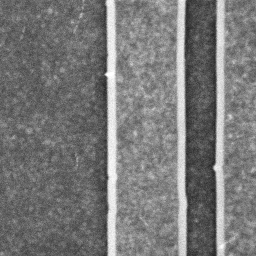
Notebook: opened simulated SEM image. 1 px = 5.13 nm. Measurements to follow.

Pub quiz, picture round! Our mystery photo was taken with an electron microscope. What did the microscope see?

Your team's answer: one or a few lines or trenches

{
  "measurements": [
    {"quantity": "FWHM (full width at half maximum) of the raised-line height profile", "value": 359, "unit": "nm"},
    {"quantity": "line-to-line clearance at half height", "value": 197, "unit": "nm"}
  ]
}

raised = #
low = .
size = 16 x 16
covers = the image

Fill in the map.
.......####...##
.......####...##
.......####...##
.......####...##
.......####...##
.......####...##
.......####...##
.......####...##
.......####...##
.......####...##
.......####...##
.......####...##
.......####...##
.......####...##
.......####...##
.......####...##